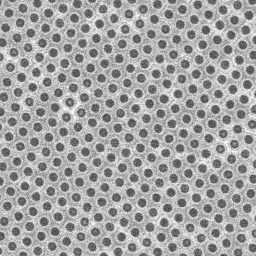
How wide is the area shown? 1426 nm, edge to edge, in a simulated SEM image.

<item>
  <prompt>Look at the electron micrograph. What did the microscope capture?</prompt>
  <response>a regular array of holes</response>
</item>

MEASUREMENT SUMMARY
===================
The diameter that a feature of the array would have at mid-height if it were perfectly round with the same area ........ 9.37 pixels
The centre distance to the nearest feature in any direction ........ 81.9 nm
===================